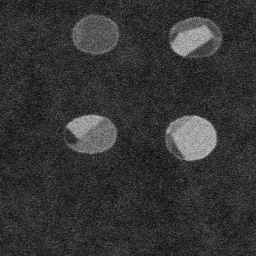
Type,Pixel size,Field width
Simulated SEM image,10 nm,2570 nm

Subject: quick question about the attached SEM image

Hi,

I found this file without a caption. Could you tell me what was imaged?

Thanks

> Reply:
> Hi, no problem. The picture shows raised bodies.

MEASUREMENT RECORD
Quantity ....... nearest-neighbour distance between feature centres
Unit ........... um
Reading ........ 1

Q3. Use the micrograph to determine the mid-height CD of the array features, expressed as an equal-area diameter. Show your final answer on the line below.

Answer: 451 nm